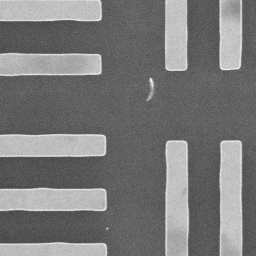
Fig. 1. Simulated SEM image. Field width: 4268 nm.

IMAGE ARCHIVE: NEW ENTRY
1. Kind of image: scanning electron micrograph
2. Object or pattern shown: groups of lines, slits or small figures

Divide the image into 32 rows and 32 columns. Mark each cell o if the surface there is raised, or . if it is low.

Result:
ooooooooooooo........oo.....oo..
ooooooooooooo........oo.....oo..
oooooooo.ooo.........oo.....oo..
.....................oo.....oo..
.....................oo.....oo..
.....................oo.....oo..
.....................oo.....oo..
ooooooooooooo........oo.....oo..
ooooooooooooo........oo.....oo..
................................
................................
................................
................................
................................
................................
................................
................................
ooooooooooooo...................
ooooooooooooo........oo.....oo..
oooooooooooo.........oo.....oo..
.....................oo.....oo..
.....................oo.....oo..
.....................oo.....oo..
.....................oo.....oo..
ooooooooooooo........oo.....oo..
ooooooooooooo........oo.....oo..
.....................oo.....oo..
.....................oo.....oo..
.....................oo.....oo..
.....................oo.....oo..
ooooooooooooo........oo.....oo..
ooooooooooooo........oo.....oo..